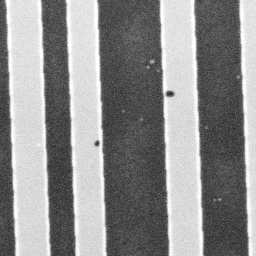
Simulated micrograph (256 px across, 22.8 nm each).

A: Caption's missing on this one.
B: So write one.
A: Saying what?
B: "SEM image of lines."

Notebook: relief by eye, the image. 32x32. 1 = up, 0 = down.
01111000111100000000111100000011
01111000111100000000111100000011
01111000111100000000111100000011
01111000011100000000111100000011
01111000011100000000111100000011
01111000011100000000111100000011
01111000011100000000111100000011
01111000011100000000111100000011
01111000011100000000011100000011
01111000011100000000011100000011
01111000011100000000011100000011
01111000011100000000011100000001
01111000011100000000011110000001
01111000011100000000011110000001
00111000011110000000011110000001
00111000011110000000011110000001
00111100011110000000011110000001
00111100011110000000011110000001
00111100011110000000011110000001
00111100011110000000011110000001
00111100011110000000011110000001
00111100011110000000011110000001
00111100011110000000011110000001
00111100011110000000011110000001
00111100011110000000011110000001
00111100011110000000011110000001
00111100011110000000011110000001
00111100011110000000011110000001
00111100011110000000011110000001
00111100001110000000011110000001
00111100001110000000011110000001
00111100001110000000011110000001